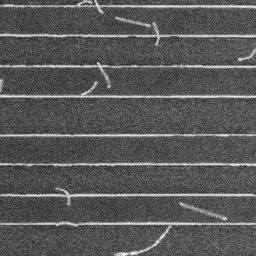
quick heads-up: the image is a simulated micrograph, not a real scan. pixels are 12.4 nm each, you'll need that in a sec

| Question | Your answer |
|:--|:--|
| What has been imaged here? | lines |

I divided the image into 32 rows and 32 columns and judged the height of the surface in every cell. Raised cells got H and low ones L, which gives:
LLLLLLLLLLLLLLLLLLLLLLLLLLLLLLLL
HHHHHHHHHHHHHHHHHHHHHHHHHHHHHHHH
HHHHHHHHHHHHHHHHHHHHHHHHHHHHHHHH
HHHHHHHHHHHHHHHHHHHHHHHHHHHHHHHH
LLLLLLLHLLLHHHLLLLHHLLHHHHHHHHHH
LLLLLLLLLLLLLLLLLLLLLLLLLLLLLLLL
LLLLLLLLLLLLLLLLLLLLLLLLLLLLLLLL
LLLLLLLLLLLLLLLLLLLLLLLLLLLLLLLL
HHHHHHHHHHHHHHHHHHHHHHHHHHHHHHHH
HHHHHHHHHHHHHHHHHHHHHHHHHHHHHHHH
HHHHHHHHHHHHHHHHHHHHHHHHHHHHHHHH
HHHHHHHHHHHHHHHHHHHHHHHHHHHHHHHH
LLLLLLLLLLLLLLLLLLLLLLLLLLLLLLLL
LLLLLLLLLLLLLLLLLLLLLLLLLLLLLLLL
LLLLLLLLLLLLLLLLLLLLLLLLLLLLLLLL
LLLLLLLLLLLLLLLLLLLLLLLLLLLLLLLL
LLLLLLLLLLLLLLLLLLLLLLLLLLLLLLLL
HHHHHHHHHHHHHHHHHHHHHHHHHHHHHHHH
HHHHHHHHHHHHHHHHHHHHHHHHHHHHHHHH
HHHHHHHHHHHHHHHHHHHHHHHHHHHHHHHH
HHHHHHHHHHHHHHHHHHHHHHHHHHHHHHHH
LLLLLLLLLLLLLLLLLLLLLLLLLLLLLLLL
LLLLLLLLLLLLLLLLLLLLLLLLLLLLLLLL
LLLLLLLLLLLLLLLLLLLLLLLLLLLLLLLL
HHHHHHHHHHHHHHHHHHHHHHHHHHHHHHHH
HHHHHHHHHHHHHHHHHHHHHHHHHHHHHHHH
HHHHHHHHHHHHHHHHHHHHHHHHHHHHHHHH
HHHHHHHHHHHHHHHHHHHHHHHHHHHHHHHH
LLLLLLLLLLLLLLLLLLLLLLLLLLLLLLLL
LLLLLLLLLLLLLLLLLLLLLLLLLLLLLLLL
LLLLLLLLLLLLLLLLLLLLLLLLLLLLLLLL
LLLLLLLLLLLLLLLLLLLLLLLLLLLLLLLL